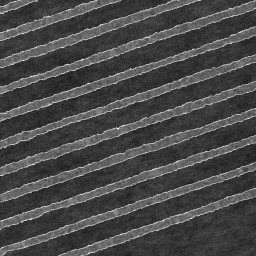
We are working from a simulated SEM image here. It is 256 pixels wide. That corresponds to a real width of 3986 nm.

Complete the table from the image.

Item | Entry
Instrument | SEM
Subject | parallel lines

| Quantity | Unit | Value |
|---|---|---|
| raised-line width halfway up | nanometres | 119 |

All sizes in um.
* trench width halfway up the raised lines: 0.275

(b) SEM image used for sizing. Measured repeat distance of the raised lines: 398 nanometers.